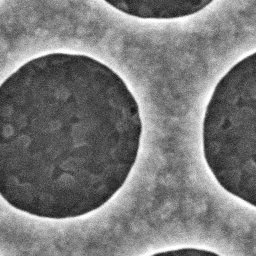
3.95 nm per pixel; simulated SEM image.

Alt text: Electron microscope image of holes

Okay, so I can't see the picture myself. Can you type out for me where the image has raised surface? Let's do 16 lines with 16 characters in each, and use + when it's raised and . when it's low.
+++++++......+++
++++++++++++++++
++++++++++++++++
+++..++++++++++.
+......+++++++..
........+++++...
.........++++...
.........++++...
.........++++...
.........++++...
........+++++...
........++++++..
.......++++++++.
++...+++++++++++
++++++++++++++++
+++++++++++..+++